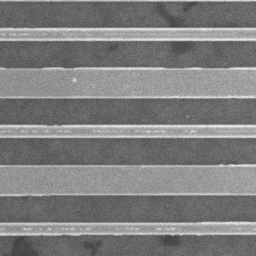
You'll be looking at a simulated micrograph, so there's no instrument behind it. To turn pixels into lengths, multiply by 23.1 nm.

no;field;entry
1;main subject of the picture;lines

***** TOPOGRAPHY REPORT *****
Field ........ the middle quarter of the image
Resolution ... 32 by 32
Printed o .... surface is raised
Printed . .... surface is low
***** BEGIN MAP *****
................................
oooooooooooooooooooooooooooooooo
oooooooooooooooooooooooooooooooo
oooooooooooooooooooooooooooooooo
oooooooooooooooooooooooooooooooo
oooooooooooooooooooooooooooooooo
oooooooooooooooooooooooooooooooo
oooooooooooooooooooooooooooooooo
................................
................................
................................
................................
................................
................................
................................
...oooo...ooooooo..oo..oo.......
oooooooooooooooooooooooooooooooo
oooooooooooooooooooooooooooooooo
................................
................................
................................
................................
................................
................................
................................
................................
oooooooooooooooooooooooooooooooo
oooooooooooooooooooooooooooooooo
oooooooooooooooooooooooooooooooo
oooooooooooooooooooooooooooooooo
oooooooooooooooooooooooooooooooo
oooooooooooooooooooooooooooooooo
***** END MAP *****